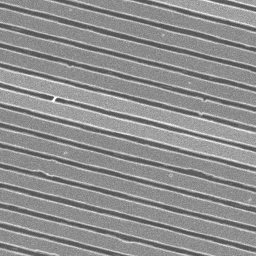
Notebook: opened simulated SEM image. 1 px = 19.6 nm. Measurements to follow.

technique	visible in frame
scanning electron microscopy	parallel lines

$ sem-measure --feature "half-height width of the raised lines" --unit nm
280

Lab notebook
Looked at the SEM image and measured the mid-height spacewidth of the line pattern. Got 97.2 nm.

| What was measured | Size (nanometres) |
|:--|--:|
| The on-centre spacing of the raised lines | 380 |